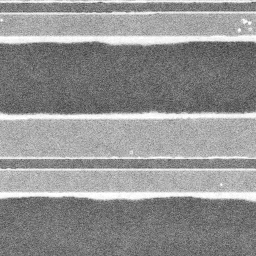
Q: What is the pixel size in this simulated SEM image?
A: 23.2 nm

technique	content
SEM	lines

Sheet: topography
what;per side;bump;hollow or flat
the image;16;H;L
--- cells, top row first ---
HHHHHHHHHHHHHHHH
HHHHHHHHHHHHHHHH
LLLLLLLLLLLLLLLL
LLLLLLLLLLLLLLLL
LLLLLLLLLLLLLLLL
LLLLLLLLLLLLLLLL
LLLLLLLLLLLLLLLL
HHHHHHHHHHHHHHHH
HHHHHHHHHHHHHHHH
HHHHHHHHHHHHHHHH
HHHHHHHHHHHHHHHH
HHHHHHHHHHHHHHHH
LLLLLLLLLLLLLLLL
LLLLLLLLLLLLLLLL
LLLLLLLLLLLLLLLL
LLLLLLLLLLLLLLLL